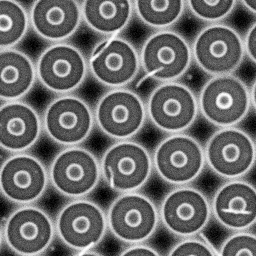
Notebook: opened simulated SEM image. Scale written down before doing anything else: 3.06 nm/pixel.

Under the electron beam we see an array of small figures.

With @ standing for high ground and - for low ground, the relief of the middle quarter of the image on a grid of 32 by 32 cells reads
@----@@----@@@----@@-----------@
@----@@-----------@@@---------@@
@----@@@----------@@@@-------@@@
----@@@@@--------@@@@@@@---@@@@@
----@@@@@@------@@@@@@@@@@@@@@@@
---@@@@@@@@@@@@@@@@@@@@@@----@@@
-@@@@@@@@@@@@@@@@@@@@@@--------@
@@@@@@@@@@@@-----@@@@@----------
@@@@@@@@@@--------@@@@----------
----@@@@@----------@@@----@@----
-----@@@@----------@@@---@@@@---
------@@@---@@@@----@@---@@@@---
@@----@@@---@@@@----@@----@@----
@@@----@@---@@@@----@@----------
@@@----@@----------@@@@---------
@@----@@@----------@@@@@-------@
------@@@@--------@@@@@@@@@-@@@@
------@@@@@@-----@@@@@@@@@@@@@@@
-----@@@@@@@@@@@@@@@@@@@@@@----@
---@@@@@@@@@@@@@@@@@@@@@@-------
@@@@@@@@@@@@@-----@@@@@@--------
@---@@@@@@@---------@@@@--------
------@@@@@---------@@@----@@@--
-------@@@-----------@@----@@@@-
--------@@----@@@----@@----@@@--
-@@@----@@----@@@@---@@-----@---
-@@@@---@@----@@@----@@@--------
-@@@@---@@-----------@@@--------
-@@@----@@@---------@@@@@@------
--------@@@---------@@@@@@@@-@@@
-------@@@@@------@@@@@@@@@@@@@@
------@@@@@@@@@@@@@@@@@@@@@@@--@